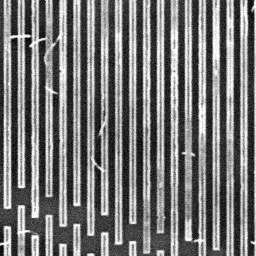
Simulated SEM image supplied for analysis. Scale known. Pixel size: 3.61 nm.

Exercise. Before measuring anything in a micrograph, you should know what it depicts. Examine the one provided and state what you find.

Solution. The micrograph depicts parallel lines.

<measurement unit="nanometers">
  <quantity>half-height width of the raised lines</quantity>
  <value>23.9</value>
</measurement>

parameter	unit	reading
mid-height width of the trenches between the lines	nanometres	27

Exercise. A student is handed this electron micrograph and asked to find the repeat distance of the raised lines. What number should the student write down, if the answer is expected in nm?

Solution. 50.2